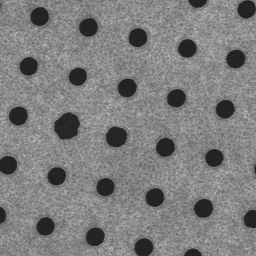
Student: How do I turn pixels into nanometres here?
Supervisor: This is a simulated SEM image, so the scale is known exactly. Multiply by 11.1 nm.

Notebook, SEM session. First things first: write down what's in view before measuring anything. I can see a regular array of holes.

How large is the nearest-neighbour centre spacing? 50.1 pixels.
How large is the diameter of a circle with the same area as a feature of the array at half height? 210 nm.